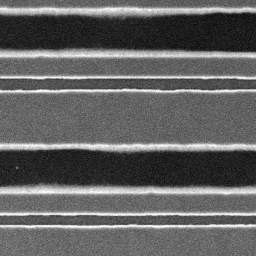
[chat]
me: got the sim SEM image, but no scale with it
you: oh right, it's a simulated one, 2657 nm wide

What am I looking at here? lines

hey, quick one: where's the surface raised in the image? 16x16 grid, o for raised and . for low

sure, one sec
oooooooooooooooo
................
................
oooooooooooooo..
oooooooooooooooo
oooooooooooooooo
oooooooooooooooo
oooooooooooooooo
oooooooooooooooo
................
................
................
oooooooooooooooo
oooooooooooooooo
oooooooooooooooo
oooooooooooooooo